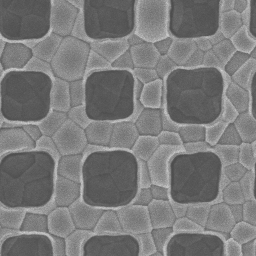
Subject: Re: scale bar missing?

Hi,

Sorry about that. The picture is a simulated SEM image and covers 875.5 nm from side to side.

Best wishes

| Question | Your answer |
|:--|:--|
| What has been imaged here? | holes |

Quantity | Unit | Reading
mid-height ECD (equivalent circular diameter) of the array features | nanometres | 194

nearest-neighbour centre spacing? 283 nm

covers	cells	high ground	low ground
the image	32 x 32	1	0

00000011110000000111100000011110
00000011110000000111100000011110
00000011111000000111100000011110
00000011111000000111100000011110
00000011111000001111110000111111
11111111111111111111111111111111
11111111111111111111111111111111
11111111111111111111111111111111
11111111111111111111111110011111
10000011111000000111100000001111
00000011111000000111100000001110
00000011111000000111100000001110
00000011111000000111100000001110
00000011111000000111100000001110
00000011111000001111100000011111
11111111111111111111111100111111
11111111111111111111111111111111
11111111111111111111111111111111
11111111111111111111111111111111
10000011111000000111110000011111
00000001110000000111100000001111
00000001110000000111100000001111
00000001110000000111100000011111
00000001110000000111100000011111
00000011110000000111100000011111
00000011111000001111111111111111
11111111111111111111111111111111
11111111111111111111111111111111
11111111111111111111111111111111
11000011111100001111110000011111
00000011111000000111100000001111
00000001110000000111100000001111